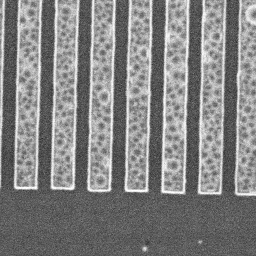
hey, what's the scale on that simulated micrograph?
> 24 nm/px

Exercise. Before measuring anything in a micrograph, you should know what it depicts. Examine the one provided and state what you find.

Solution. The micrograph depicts parallel lines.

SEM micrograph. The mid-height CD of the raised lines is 511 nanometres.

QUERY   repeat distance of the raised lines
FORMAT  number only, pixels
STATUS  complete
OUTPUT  36.9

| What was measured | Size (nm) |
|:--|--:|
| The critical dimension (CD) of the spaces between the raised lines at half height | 370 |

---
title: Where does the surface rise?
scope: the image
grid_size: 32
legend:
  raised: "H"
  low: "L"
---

LLHHHLLHHHLLHHLLHHHLLHHLLLHHLLHH
LLHHHLLHHHLLHHLLHHHLLHHLLLHHLLHH
LLHHHLLHHHLLHHLLHHHLLHHLLLHHLLHH
LLHHHLLHHHLLHHLLHHHLLHHLLHHHLLHH
LLHHHLLHHHLLHHLLHHHLLLHLLHHHLLHH
LLHHHLLHHLLLHHLLHHHLLHHLLHHHLLHH
LLHHHLLHHHLHHHLLHHHLLHHLLHHHLLHH
LLHHHLLHHHLLHHLLHHHLLHHLLHHHLLHH
LLHLHLLHHLLLHHLLHHHLLHLLLHHHLLHH
LLHHHLLHHLLLHHLLHHHLLHHLLHHHLLHH
LLHHHLLHHLLHHHLLHHHLLHHLLHHHLLHH
LLHHHLLHHLLHHHLLHHHLLHHLLHHHLLHH
LLHHHLLHHLLHHHLLHHHLLHHLLHHHLLHH
LLHHHLLHHLLHHHLLHHHLLHHLLHHHLLHH
LLHHHLLHHLLHHHLLHHHLLHHLLHHHLLHH
LLHHHLLHHLLHHHLLHHLLLHHLLHHHLLHH
LLHHHLLHHLLHHHLLHHLLHHHLLHHHLLHH
LLHHHLLHHLLHHHLLHHLLHHHLLHHHLLHH
LLHHHLLHHLLHHHLLHHLLHHHLLHHHLLHH
LLHHHLLHHLLHHHLLHHLLHHHLLHHHLLHH
LLHHHLLHHLLHHHLLHHLLHHHLLHHHLLHH
LLHHHLLHHLLHHHLLHHLLHHHLLHHHLLHH
LLHHHLLHHLLHHHLLHHLLHHHLLHHHLLHH
LLLLLLLHHLLHHLLLHHLLHHHLLHHHLLHH
LLLLLLLLLLLLLLLLLLLLLLLLLLLLLLLL
LLLLLLLLLLLLLLLLLLLLLLLLLLLLLLLL
LLLLLLLLLLLLLLLLLLLLLLLLLLLLLLLL
LLLLLLLLLLLLLLLLLLLLLLLLLLLLLLLL
LLLLLLLLLLLLLLLLLLLLLLLLLLLLLLLL
LLLLLLLLLLLLLLLLLLLLLLLLLLLLLLLL
LLLLLLLLLLLLLLLLLLLLLLLLLLLLLLLL
LLLLLLLLLLLLLLLLLLLLLLLLLLLLLLLL